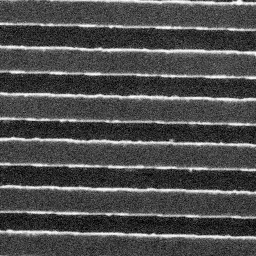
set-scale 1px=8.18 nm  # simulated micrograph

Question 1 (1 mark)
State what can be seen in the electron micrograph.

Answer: lines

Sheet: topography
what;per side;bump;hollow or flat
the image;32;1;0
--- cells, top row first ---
11111111111111111111111111111111
11111111111111111111111111111111
11111111111111111111111111111111
00000000000000000000000011111111
00000000000000000000000000000000
00000000000000000000000000000000
11111111111111111111111111111100
11111111111111111111111111111111
11111111111111111111111111111111
00000000000000000000111111111111
00000000000000000000000000000000
00000000000000000000000000000000
11111111111111111111111111111111
11111111111111111111111111111111
11111111111111111111111111111111
00000000000000000000000000000111
00000000000000000000000000000000
11111111100000000000000000000000
11111111111111111111111111111111
11111111111111111111111111111111
11111111111111111111111111111111
00000000000000000000000000000000
00000000000000000000000000000000
11111111000000000000000000000000
11111111111111111111111111111111
11111111111111111111111111111111
00001111111111111111111111111111
00000000000000000000000000000000
00000000000000000000000000000000
11111111111111111111111110000000
11111111111111111111111111111111
11111111111111111111111111111111